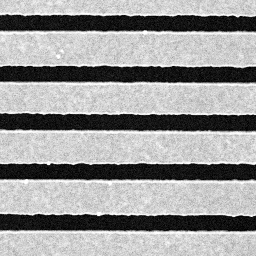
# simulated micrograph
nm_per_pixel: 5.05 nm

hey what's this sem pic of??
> lines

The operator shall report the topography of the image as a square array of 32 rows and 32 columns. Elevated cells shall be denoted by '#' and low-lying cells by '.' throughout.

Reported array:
################################
################################
................................
................................
################################
################################
################################
################################
................................
................................
################################
################################
################################
################################
................................
................................
############################....
################################
################################
################################
...........#..#...........#....#
................................
.#####.#.#......................
################################
################################
################################
################################
................................
................................
################################
################################
################################